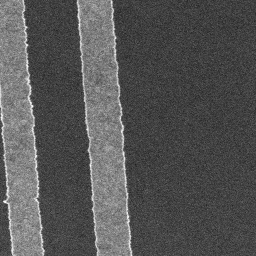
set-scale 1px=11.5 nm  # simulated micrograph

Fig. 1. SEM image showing one or a few lines or trenches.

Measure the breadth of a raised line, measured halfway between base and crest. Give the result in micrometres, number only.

0.386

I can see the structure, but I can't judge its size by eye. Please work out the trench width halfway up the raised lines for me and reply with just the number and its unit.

622 nm